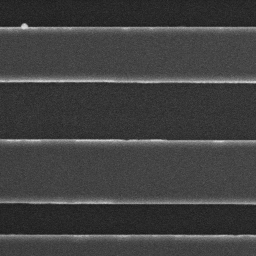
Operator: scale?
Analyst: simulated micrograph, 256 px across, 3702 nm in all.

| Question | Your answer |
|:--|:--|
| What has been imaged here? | lines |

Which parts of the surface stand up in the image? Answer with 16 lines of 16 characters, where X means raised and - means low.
----------------
----------------
XXXXXXXXXXXXXXXX
XXXXXXXXXXXXXXXX
XXXXXXXXXXXXXXXX
----------------
----------------
----------------
----------------
XXXXXXXXXXXXXXXX
XXXXXXXXXXXXXXXX
XXXXXXXXXXXXXXXX
XXXXXXXXXXXXXXXX
----------------
----------------
XXXXXXXXXXXXXXXX